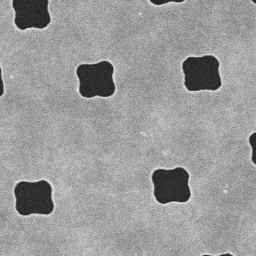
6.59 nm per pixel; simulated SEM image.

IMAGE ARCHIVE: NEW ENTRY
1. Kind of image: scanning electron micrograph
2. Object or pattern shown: holes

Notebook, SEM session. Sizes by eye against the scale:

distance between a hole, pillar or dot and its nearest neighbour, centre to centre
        731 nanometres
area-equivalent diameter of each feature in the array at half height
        253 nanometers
